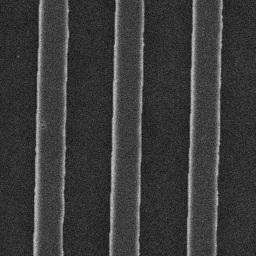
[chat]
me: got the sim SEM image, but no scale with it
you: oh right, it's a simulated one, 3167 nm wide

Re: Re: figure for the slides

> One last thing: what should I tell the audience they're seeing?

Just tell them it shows lines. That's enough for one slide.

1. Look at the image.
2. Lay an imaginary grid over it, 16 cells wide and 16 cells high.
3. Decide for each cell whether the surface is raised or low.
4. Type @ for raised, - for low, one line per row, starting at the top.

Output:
--@@---@@---@@--
--@@---@@---@@--
--@@---@@---@@--
--@@---@@---@@--
--@@---@@---@@--
--@@---@@---@@--
--@@---@@---@@--
--@@---@@---@@--
--@@---@@---@@--
--@@---@@---@@--
--@@---@@---@@--
--@@---@@---@@--
--@@---@@---@@--
--@@---@@---@@--
--@@---@@---@@--
--@@---@@---@@--